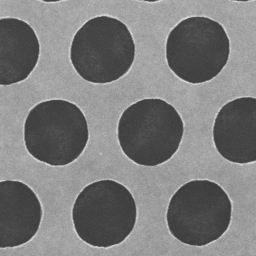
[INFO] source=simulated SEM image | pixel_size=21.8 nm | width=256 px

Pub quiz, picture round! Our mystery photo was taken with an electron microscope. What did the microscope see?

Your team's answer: holes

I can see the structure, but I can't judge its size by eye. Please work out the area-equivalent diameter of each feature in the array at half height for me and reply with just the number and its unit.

1.44 um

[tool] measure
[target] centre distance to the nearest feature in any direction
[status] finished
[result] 94.3 px